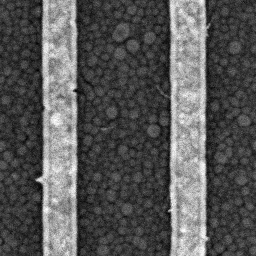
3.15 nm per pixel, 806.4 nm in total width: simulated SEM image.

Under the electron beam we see one or a few lines or trenches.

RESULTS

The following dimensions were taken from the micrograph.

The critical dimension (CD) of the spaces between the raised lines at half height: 314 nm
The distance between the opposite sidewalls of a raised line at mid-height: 0.0909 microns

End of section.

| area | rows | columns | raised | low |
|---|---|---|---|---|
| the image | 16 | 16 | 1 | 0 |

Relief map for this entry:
0001100000011000
0001100000011000
0001100000011000
0001100000011000
0001100000011000
0001100000011000
0001100000011000
0001100000011000
0001100000011000
0001100000011000
0001100000011000
0001100000011000
0001100000011000
0001100000011000
0001100000011000
0001100000011000